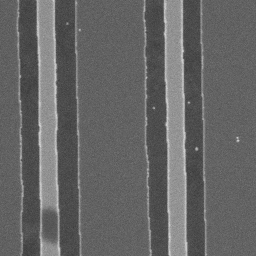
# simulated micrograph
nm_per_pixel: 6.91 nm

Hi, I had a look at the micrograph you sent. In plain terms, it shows lines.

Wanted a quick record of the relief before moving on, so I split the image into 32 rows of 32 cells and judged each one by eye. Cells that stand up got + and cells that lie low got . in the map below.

++...++..+++++++++...++..+++++++
++...++..+++++++++...++..+++++++
++...++..+++++++++...++..+++++++
++...++..+++++++++...++..+++++++
++...++..+++++++++...++..+++++++
++...++..+++++++++...++..+++++++
++...++..+++++++++...++..+++++++
++...++...++++++++...++..+++++++
++...++...++++++++...++..+++++++
+++..++...++++++++...++..+++++++
++...++...++++++++...++..+++++++
++...++...++++++++...++..+++++++
+++..++...++++++++...++..+++++++
+++..++...++++++++...++..+++++++
+++..++...++++++++...++..+++++++
+++..++...++++++++...++..+++++++
+++..++...++++++++...++..+++++++
+++..++...++++++++...++..+++++++
+++..++...++++++++...++..+++++++
+++..++...++++++++...++..+++++++
+++..++...+++++++++..++..+++++++
+++..++...+++++++++..++..+++++++
+++..++...++++++++...++..+++++++
+++..++...+++++++++..++...++++++
+++..++...+++++++++..++...++++++
+++..++...+++++++++..++...++++++
+++..++...+++++++++..++...++++++
+++..++...+++++++++..++...++++++
+++..++...+++++++++..++...++++++
+++..++...+++++++++..++...++++++
+++..++...+++++++++..++...++++++
+++..++...+++++++++..++...++++++